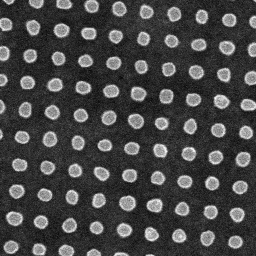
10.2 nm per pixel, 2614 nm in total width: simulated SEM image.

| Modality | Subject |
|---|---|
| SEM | a regular array of raised bodies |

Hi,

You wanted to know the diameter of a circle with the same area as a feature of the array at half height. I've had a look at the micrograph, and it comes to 136 nm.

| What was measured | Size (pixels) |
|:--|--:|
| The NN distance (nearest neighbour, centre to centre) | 27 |